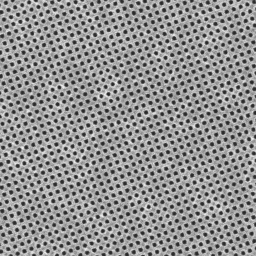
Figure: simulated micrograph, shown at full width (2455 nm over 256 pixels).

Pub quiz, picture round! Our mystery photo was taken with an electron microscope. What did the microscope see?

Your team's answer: a regular array of holes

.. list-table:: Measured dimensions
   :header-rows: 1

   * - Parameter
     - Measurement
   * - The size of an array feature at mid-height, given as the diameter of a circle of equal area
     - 43.3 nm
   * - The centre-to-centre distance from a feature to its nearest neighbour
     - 68.5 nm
